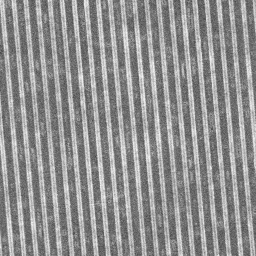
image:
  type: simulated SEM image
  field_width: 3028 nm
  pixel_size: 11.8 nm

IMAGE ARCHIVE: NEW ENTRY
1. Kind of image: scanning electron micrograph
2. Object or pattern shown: parallel lines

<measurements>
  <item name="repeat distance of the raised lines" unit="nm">142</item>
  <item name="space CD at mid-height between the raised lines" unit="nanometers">97.2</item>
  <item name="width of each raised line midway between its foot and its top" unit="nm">44.2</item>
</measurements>